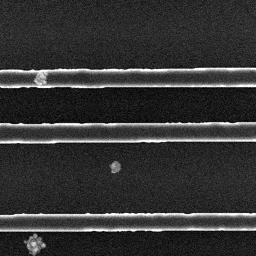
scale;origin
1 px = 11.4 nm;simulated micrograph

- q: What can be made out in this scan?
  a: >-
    lines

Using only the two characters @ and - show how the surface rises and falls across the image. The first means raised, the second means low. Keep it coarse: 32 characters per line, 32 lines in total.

--------------------------------
--------------------------------
--------------------------------
--------------------------------
--------------------------------
--------------------------------
--------------------------------
--------------------------------
--------------------------------
@@@@@@@@@@@@@@@@@@@@@@@@@@@@@@@@
@@@@@@@@@@@@@@@@@@@@@@@@@@@@@@@@
--------------------------------
--------------------------------
--------------------------------
--------------------------------
@@@--@@@@@@@@@@@@@@@@@@@@@@@@@@@
@@@@@@@@@@@@@@@@@@@@@@@@@@@@@@@@
@@@@@@@@@@@@@@@@@@@@@@@@@@@@@@@@
--------------------------------
--------------------------------
--------------------------------
--------------------------------
--------------------------------
--------------------------------
--------------------------------
--------------------------------
--------------------------------
@@@@@@@@@@@@@@@@@@@@@@@@@@@@@@@@
@@@@@@@@@@@@@@@@@@@@@@@@@@@@@@@@
--------------------------------
--------------------------------
--------------------------------